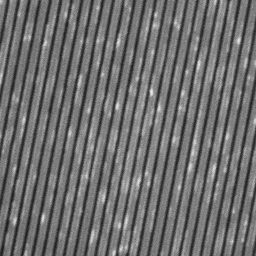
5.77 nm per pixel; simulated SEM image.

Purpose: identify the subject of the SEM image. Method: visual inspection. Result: parallel lines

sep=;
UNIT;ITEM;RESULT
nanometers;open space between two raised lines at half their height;21.3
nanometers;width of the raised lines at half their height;37.5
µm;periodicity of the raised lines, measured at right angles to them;0.0596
